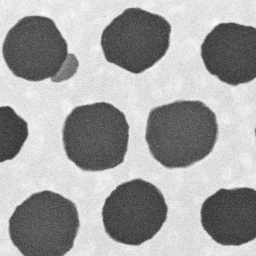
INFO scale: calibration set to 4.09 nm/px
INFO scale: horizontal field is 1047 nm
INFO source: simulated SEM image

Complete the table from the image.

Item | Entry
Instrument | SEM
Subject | holes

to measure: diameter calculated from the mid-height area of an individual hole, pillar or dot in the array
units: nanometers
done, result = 282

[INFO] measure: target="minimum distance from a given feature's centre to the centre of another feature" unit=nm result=349